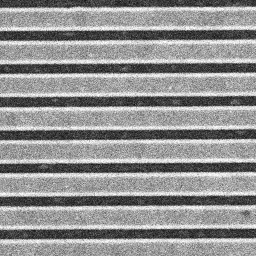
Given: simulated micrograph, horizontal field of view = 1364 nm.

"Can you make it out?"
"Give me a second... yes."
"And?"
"parallel lines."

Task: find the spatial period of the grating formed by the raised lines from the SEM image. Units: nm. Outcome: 176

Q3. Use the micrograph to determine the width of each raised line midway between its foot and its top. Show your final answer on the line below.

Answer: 0.107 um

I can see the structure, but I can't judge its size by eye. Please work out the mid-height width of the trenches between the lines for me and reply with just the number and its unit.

13 px